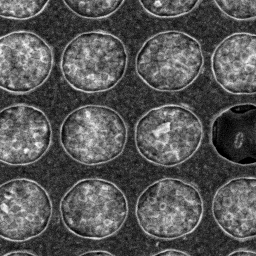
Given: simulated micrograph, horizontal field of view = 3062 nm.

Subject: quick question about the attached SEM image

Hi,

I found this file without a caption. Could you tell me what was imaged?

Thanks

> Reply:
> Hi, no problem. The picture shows holes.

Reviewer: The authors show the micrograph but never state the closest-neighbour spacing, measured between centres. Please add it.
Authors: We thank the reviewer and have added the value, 0.882 µm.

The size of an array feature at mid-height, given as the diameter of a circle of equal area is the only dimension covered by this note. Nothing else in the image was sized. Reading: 744 nm